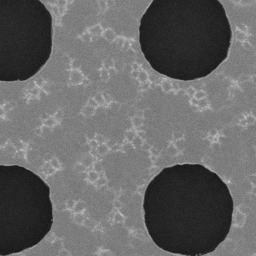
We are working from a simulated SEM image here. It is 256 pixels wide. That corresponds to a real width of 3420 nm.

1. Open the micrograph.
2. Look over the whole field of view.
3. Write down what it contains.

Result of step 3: holes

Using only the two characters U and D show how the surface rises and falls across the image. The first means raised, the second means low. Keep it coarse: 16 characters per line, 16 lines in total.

DDDUUUUUUDDDDDUU
DDDUUUUUUDDDDDUU
DDDUUUUUUDDDDDUU
DDDUUUUUUDDDDDUU
DDUUUUUUUUDDDUUU
UUUUUUUUUUUUUUUU
UUUUUUUUUUUUUUUU
UUUUUUUUUUUUUUUU
UUUUUUUUUUUUUUUU
UUUUUUUUUUUUUUUU
DDUUUUUUUUDDDUUU
DDDUUUUUUDDDDDUU
DDDUUUUUUDDDDDDU
DDDUUUUUUDDDDDDU
DDDUUUUUUDDDDDUU
DDUUUUUUUUDDDUUU